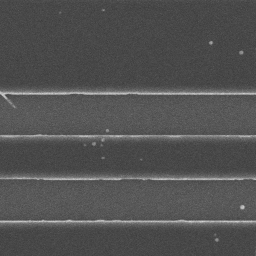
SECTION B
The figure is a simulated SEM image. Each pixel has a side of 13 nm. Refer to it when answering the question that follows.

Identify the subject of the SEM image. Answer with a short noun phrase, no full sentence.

lines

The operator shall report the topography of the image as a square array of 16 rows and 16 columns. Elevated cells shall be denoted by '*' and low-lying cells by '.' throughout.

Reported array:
****************
****************
****************
****************
****************
****************
................
................
****************
****************
****************
................
................
................
****************
****************